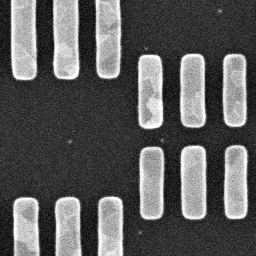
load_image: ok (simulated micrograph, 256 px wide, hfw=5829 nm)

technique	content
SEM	wiring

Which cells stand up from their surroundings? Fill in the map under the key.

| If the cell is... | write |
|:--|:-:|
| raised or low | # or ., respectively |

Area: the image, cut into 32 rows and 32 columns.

..##...###..###.................
..##...###..###.................
..##...###..###.................
..##...###..###.................
..##...###..###.................
..##...###..###.................
..##...###..###.................
..##...###..###..###...##...###.
..##...###..###..###...###..###.
..##...##....#...###...###..###.
.................###...###..###.
.................###...###..###.
.................###...###..###.
.................###...###..###.
.................###...###..###.
..................##...##...##..
................................
................................
..................##...##....#..
..................##...###..###.
..................##...###..###.
..................##...###..###.
..................##...###..###.
..................##...###..###.
..................##...###..###.
..###..###..###...##...###..###.
..###..###..###...##...###..###.
..###..###..###.................
..###..###..###.................
..###..###..###.................
..###..###..###.................
..###..###..###.................